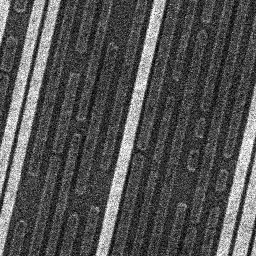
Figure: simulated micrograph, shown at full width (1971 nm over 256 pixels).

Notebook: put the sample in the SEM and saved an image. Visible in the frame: parallel lines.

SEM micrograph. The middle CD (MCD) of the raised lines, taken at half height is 67.6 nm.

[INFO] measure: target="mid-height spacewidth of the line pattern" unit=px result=7.79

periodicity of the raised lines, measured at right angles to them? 129 nm